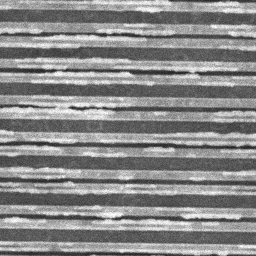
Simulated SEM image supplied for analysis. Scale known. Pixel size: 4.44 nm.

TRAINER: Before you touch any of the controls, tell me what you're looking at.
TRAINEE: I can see parallel lines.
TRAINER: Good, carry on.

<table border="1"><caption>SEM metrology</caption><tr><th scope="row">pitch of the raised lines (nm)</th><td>81.6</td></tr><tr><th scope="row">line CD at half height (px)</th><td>8.76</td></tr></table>